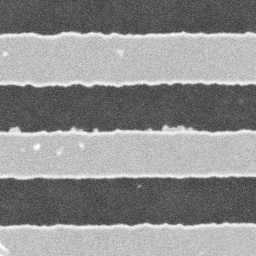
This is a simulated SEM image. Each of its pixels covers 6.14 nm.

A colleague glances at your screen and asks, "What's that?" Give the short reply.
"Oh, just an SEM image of lines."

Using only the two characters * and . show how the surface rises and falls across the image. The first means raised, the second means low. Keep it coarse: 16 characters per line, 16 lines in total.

................
................
****************
****************
****************
................
................
................
****************
****************
****************
................
................
................
****************
****************